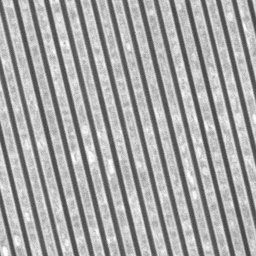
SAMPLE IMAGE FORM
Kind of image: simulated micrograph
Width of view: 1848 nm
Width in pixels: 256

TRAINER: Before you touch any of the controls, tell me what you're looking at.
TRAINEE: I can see parallel lines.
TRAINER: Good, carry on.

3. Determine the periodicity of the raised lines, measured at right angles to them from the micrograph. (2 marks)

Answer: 110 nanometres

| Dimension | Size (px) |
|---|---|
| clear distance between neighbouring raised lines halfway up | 6.19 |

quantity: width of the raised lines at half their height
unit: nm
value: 70.2